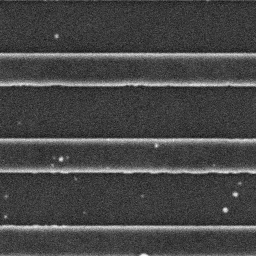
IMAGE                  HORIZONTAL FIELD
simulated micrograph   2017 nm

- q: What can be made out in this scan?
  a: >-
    lines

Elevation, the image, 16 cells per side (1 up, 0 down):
0000000000000000
0000000000000000
0000000000000000
1111111111111111
1111111111111111
0000000000000000
0000000000000000
0000000000000000
0000000000000000
1111111111111111
1111111111111111
0000000000000000
0000000000000000
0000000000000000
1111111111111111
1111111111111111